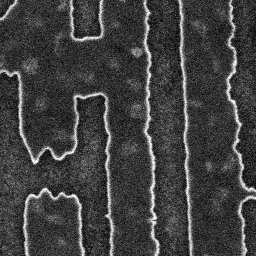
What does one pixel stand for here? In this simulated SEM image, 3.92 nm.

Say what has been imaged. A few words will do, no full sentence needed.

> one or a few lines or trenches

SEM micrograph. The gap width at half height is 32.4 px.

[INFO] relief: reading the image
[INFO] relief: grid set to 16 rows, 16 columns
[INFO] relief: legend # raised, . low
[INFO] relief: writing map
.###..###..###..
#####.###..####.
#########..###..
#########..####.
#########..####.
.########...##..
.####..##...###.
.####..##...###.
.####..##...###.
..##...##...###.
.......###..###.
.......###..###.
..###..###..###.
..###..###..###.
..###..###..###.
..###..###..###.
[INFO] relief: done